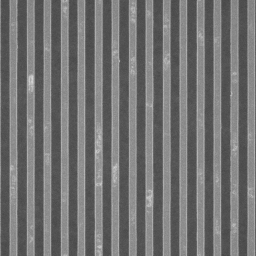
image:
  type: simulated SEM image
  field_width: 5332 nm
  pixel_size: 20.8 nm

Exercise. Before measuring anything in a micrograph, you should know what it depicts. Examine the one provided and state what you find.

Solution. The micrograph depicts parallel lines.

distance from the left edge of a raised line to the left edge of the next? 354 nm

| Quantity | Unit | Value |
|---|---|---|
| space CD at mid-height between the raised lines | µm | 0.198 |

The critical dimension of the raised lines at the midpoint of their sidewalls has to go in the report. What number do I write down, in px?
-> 7.25